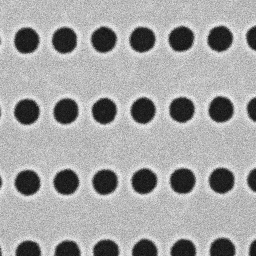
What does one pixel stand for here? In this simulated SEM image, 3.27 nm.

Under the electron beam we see a regular array of holes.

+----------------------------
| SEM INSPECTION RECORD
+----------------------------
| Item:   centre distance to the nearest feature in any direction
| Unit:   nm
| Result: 126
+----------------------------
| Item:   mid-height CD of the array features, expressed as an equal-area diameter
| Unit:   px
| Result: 26.1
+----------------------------